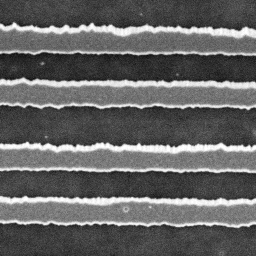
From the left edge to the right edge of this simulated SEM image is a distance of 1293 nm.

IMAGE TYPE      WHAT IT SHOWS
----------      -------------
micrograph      lines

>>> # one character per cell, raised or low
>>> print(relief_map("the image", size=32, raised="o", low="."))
................................
................................
................................
oooo......oo.o....o.............
oooooooooooooooooooooooooooooooo
oooooooooooooooooooooooooooooooo
oooooooooooooooooooooooooooooooo
................................
................................
................................
ooooooooooooooooooooooooooooo...
oooooooooooooooooooooooooooooooo
oooooooooooooooooooooooooooooooo
............o.................o.
................................
................................
................................
................................
ooooooooooooooooooo.o.oooooooooo
oooooooooooooooooooooooooooooooo
oooooooooooooooooooooooooooooooo
......................o...oo...o
................................
................................
................................
oooooooooooooooooooooooooooooooo
oooooooooooooooooooooooooooooooo
oooooooooooooooooooooooooooooooo
................................
................................
................................
................................